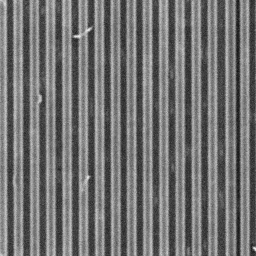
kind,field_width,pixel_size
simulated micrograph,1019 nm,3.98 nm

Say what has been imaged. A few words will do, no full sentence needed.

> parallel lines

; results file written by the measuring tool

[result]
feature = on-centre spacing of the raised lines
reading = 64.5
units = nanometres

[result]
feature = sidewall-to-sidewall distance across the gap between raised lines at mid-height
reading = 30.8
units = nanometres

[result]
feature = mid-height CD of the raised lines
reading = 34.3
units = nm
